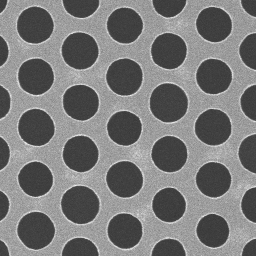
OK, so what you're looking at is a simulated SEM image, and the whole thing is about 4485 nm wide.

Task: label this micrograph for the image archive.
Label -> a regular array of holes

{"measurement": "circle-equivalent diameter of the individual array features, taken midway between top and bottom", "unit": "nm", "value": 635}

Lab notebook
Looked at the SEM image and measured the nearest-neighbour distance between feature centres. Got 0.892 µm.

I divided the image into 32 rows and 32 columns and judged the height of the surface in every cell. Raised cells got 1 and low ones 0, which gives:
01111111000011111110000111111100
11100011000011000111000110001110
11000001111110000011111110000111
11000001111110000011111110000111
11100011100111000111001110001110
01111111000011111110000111111100
01111111000011111110000111111100
01110111000011101110000111011100
11000011100111000011001110000110
11000001111110000011111110000111
11000001111111000011001110000111
01100011000011000110000111001110
01111111000011111110000111111100
01111111000011111110000111111100
01100011100011000110000110001110
11000001111110000011111100000111
11000001111110000011111100000111
01100011100111000111000110001100
01111111000011111110000111111100
01111111000011111110000111111100
01100111000011000110000111001100
11000011110110000011101110000110
11000001111110000011111100000111
11100011100111000011101110000111
01110111000011100110000111001100
01111111000011111110000111111100
01111111000011111110000111111100
11100011100011000111001110001110
11000001111110000011111110000111
11000001111111000011111110000111
01100011000011000111000110001110
01111111000011111110000111111100